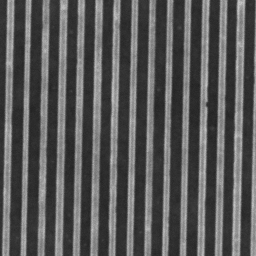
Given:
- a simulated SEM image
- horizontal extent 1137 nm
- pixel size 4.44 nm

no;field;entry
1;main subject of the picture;parallel lines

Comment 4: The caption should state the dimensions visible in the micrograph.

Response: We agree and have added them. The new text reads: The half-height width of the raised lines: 5 pixels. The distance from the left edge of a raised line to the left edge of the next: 78.7 nm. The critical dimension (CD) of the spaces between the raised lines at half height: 56.6 nanometers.